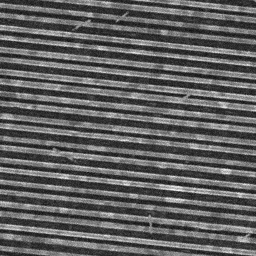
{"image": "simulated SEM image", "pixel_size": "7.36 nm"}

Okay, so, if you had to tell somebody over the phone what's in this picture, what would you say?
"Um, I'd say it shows parallel lines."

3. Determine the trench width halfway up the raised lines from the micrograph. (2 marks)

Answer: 43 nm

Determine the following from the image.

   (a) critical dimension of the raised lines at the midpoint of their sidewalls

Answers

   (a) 4.85 px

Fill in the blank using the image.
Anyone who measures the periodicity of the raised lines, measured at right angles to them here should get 80.8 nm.